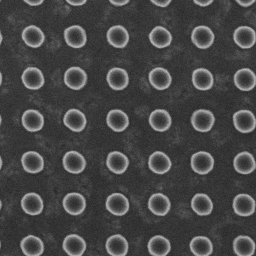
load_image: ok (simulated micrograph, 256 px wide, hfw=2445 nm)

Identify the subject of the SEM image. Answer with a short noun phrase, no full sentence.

a regular array of raised bodies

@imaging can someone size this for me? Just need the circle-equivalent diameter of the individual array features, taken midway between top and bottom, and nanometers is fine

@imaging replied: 201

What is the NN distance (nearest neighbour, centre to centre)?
398 nanometres